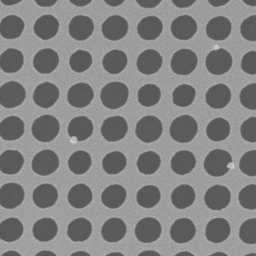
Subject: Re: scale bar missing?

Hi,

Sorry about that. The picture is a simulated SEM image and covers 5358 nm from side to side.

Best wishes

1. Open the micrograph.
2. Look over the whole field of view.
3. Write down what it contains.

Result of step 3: a regular array of holes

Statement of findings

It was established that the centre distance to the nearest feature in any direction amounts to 701 nm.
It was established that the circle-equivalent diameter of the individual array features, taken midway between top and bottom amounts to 534 nm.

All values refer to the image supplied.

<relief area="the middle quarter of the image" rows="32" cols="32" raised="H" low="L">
HLLLLLLHHHLLLLLLHHLLLLLLHHHLLLLL
HHLLLLHHHHLLLLLHHHLLLLLLHHHLLLLL
HHHHHHHHHHHHLHHHHHHHLLHHHHHHLLLH
HHHHHHHHHHHHHHHHHHHHHHHHHHHHHHHH
HHHHHHHHHHHHLLHHHHHHHHHHHHHHHHHH
HHLLLLLHHHLLLLLLHHHHLLLHHHHHHLLL
HLLLLLLHHLLLLLLLHHHLLLLLHHHHLLLL
HLLLLLLLHLLLLLLLHHLLLLLLHHHLLLLL
HLLLLLLHHLLLLLLLHHLLLLLLHHHLLLLL
HLLLLLLHHLLLLLLLHHHLLLLLHHHLLLLL
HHLLLLHHHHLLLLLHHHHHLLHHHHHHLLLH
HHHHHHHHHHHHHHHHHHHHHHHHHHHHHHHH
HHHHHHHHHHHHHHHHHHHHHHHHHHHHHHHH
HHLLLLHHHHHLLLLHHHHLLLLLHHHHLLLL
HLLLLLLHHHLLLLLLHHHLLLLLHHHLLLLL
HLLLLLLHHLLLLLLLHHLLLLLLLHLLLLLL
HLLLLLLHHLLLLLLLHHLLLLLLLHLLLLLL
HLLLLLLHHLLLLLLLHHLLLLLLHHLLLLLL
HHHLLLHHHHLLLLLHHHHLLLLLHHHLLLLL
HHHHHHHHHHHLLHHHHHHHLLHHHHHHHLLH
HHHHHHHHHHHHHHHHHHHHHHHHHHHHHHHH
HHHHLHHHHHHHHHHHHHHHHHHHHHHHHHLH
HHLLLLHHHHHLLLLHHHHLLLLLHHHHLLLL
HLLLLLLHHHLLLLLLHHLLLLLLHHHLLLLL
HLLLLLLHHLLLLLLLHHLLLLLLHHHLLLLL
HLLLLLLHHHLLLLLHHHLLLLLLHHHLLLLL
HLLLLLHHHHLLLLLHHHHLLLLHHHHLLLLL
HHHLLHHHHHHLLHHHHHHHLLHHHHHHLLLH
HHHHHHHHHHHHHHHHHHHHHHHHHHHHHHHH
HHHHHHHHHHHHHHHHHHHHHHHHHHHHHHHH
HHLLLLHHHHHLLLHHHHHHLLLHHHHHHLLL
HLLLLLLHHHLLLLLHHHHLLLLLHHHLLLLL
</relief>